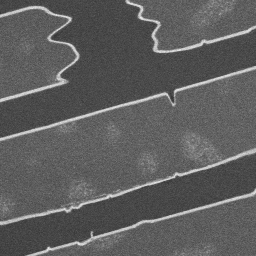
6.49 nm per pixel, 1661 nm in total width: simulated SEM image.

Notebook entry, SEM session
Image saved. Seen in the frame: one or a few lines or trenches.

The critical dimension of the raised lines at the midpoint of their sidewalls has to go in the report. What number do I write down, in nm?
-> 536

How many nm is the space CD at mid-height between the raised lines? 243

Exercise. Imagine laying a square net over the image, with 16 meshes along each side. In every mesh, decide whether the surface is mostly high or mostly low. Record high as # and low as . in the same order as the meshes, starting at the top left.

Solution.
.........#######
####......######
####......####..
#####...........
####...........#
###.........####
........########
....############
.###############
################
#############...
#########.......
######........##
##.........#####
.......#########
...#############